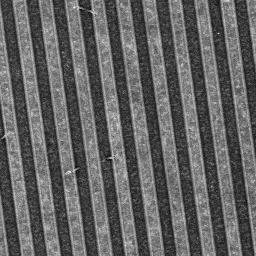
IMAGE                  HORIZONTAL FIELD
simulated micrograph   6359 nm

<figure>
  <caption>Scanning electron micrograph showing parallel lines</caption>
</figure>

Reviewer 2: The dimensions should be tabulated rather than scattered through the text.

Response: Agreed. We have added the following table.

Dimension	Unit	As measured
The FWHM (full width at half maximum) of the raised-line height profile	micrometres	0.295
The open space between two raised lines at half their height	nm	338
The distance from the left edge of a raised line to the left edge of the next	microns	0.639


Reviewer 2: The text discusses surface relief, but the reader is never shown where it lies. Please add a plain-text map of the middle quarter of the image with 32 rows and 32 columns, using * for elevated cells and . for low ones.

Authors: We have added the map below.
...**....***...***....***....**.
...***...***....**....***....***
...***...***....***...***....***
...***...****...***...***....***
...***....***...***...***....***
...***....***...***....**....***
...***....***...***....***...***
....**....***...***....***....**
....***...***....**....***....**
....***...***....***...***....**
....***...***....***...***....**
*...***....**....***...***....**
*...***....***...***....**....**
*...***....***...***....***...**
*....**....***...***....***...**
*....***...***....**....***....*
*....***...***....***...***....*
*....***...***....***...***....*
*....***...***....***...***....*
**...***....**....***....**....*
**...***....***...***....**....*
**...***....***...***....***...*
**....**....***...***....***....
**....***...***....**....***....
**....***...***....***...***....
**....***...***....***...***....
***...***....**....***...***....
***...***....***...***....**....
***...***....***...***....***...
***....**....***...***....***...
***....***...***....**....***...
***....***...***....***...***...